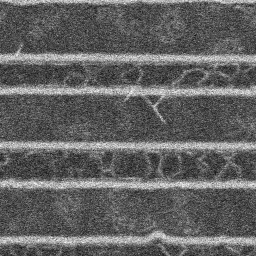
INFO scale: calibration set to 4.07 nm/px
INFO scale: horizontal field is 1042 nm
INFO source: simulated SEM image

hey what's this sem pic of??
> one or a few lines or trenches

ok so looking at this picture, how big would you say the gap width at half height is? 0.222 micrometres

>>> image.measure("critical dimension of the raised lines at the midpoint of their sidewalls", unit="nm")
153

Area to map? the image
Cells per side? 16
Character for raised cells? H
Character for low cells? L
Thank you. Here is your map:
LLLLLLLLLLLLLLLL
LLLLLLLLLLLLLLLL
LLLLLLLLLLLLLLLL
LLLLLLLLLLLLLLLL
HHHHHHHHHHHHHHHH
HHHHHHHHHHHHHHHH
LLLLLLLLLLLLLLLL
LLLLLLLLLLLLLLLL
LLLLLLLLLLLLLLLL
HHHHHHHHHHHHHHHH
HHHHHHHHHHHHHHHH
LHHHHLHHHHHHHHHH
LLLLLLLLLLLLLLLL
LLLLLLLLLLLLLLLL
LLLLLLLLLLLLLLLL
HHHHHHHHHHHHHHHH